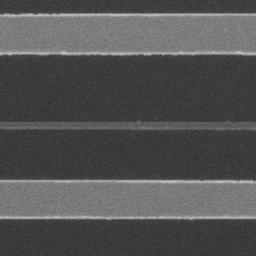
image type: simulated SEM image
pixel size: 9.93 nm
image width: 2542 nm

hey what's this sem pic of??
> lines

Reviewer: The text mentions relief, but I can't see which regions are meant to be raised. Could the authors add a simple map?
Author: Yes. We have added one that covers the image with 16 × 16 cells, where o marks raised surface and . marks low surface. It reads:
................
oooooooooooooooo
oooooooooooooooo
................
................
................
................
................
................
................
................
oooooooooooooooo
oooooooooooooooo
oooooooooooooooo
................
................